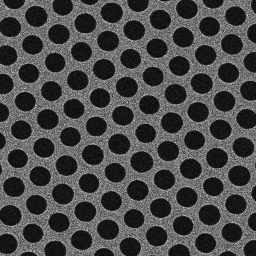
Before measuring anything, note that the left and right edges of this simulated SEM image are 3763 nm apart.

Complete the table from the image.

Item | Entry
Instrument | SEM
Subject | a regular array of holes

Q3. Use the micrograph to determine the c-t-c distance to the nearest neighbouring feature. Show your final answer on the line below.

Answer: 416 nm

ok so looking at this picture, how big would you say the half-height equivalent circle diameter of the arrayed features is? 303 nm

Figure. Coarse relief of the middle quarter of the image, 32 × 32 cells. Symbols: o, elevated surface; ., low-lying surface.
ooooooo......oo...oooooooo......
ooooooo......ooooooo....ooo....o
o....oo......ooooooo.....oo...oo
o.....oo....oo...ooo.....ooooooo
o.....ooooooo.....oo.....ooooooo
o.....ooooooo.....oooo.ooo...ooo
oo..ooo...ooo.....ooooooo.....oo
ooooooo....ooo....ooooooo......o
oooooo......ooooooo....oo......o
....ooo....oooooooo.....oo....oo
.....ooo...ooo.oooo.....ooooooo.
.....ooooooo.....oo.....ooooooo.
.....ooooooo.....ooo..ooo...ooo.
oo..oo...ooo.....ooooooo.....oo.
oooooo....ooo....ooooooo......oo
ooooo......oooooooo...oo......oo
...ooo.....ooooooo.....oo....ooo
....oo....ooo.oooo.....oooooooo.
....oooooooo....oo.....ooooooo..
....ooooooo......oo...ooo..ooo..
o..ooo..ooo......ooooooo....ooo.
ooooo.....oo....ooooooo......ooo
oooo......ooo..ooo...oo......ooo
..ooo.....ooooooo.....oo....oooo
...oo....oooooooo.....oooooooo..
...oooooooo....oo.....ooooooo...
...ooooooo.....ooo...ooo..ooo...
..ooo..ooo.....oooooooo....oo...
oooo....ooo....ooooooo......oo..
oooo.....ooo..ooo...ooo.....oooo
.ooo.....ooooooo.....oo....ooooo
..oo....oooooooo.....oooooooo...